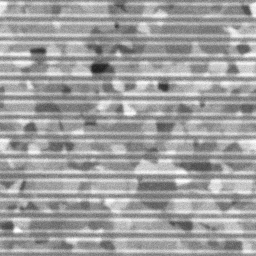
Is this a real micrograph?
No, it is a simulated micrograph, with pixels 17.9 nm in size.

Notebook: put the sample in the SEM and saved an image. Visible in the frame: parallel lines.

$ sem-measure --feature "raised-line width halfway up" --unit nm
213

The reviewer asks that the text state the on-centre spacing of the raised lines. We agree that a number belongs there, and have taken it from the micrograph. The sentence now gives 19.6 pixels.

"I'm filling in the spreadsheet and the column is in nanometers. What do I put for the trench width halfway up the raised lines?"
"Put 141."